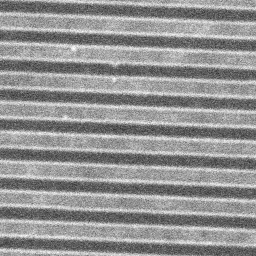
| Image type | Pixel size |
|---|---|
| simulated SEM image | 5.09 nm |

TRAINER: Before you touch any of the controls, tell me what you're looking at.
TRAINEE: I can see parallel lines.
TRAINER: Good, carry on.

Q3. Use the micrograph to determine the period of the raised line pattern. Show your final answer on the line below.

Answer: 150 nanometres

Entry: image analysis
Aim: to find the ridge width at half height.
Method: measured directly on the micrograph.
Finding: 0.0807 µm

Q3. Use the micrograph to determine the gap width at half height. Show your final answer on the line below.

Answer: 71.2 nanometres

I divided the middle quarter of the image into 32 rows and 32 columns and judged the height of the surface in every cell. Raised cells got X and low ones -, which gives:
XXXXXXXXXXXXXXXXXXXXXXXXXXXXXXXX
XXXXXXXXXXXXXXXXXXXXXXXXXXXXXXXX
XXXXXXXXXXXXXXXXXXXXXXXXXXXXXXXX
------------XX-XXXXXXXXXXXXXXXXX
--------------------------------
--------------------------------
XX------------------------------
XXXXXXXXXXXXXXXXXXXXXXXXXXX-----
XXXXXXXXXXXXXXXXXXXXXXXXXXXXXXXX
XXXXXXXXXXXXXXXXXXXXXXXXXXXXXXXX
---------XXXXXXXXXXXXXXXXXXXXXXX
--------------------------------
--------------------------------
X-------------------------------
XXXXXXXXXXXXXXX-----------------
XXXXXXXXXXXXXXXXXXXXXXXXXXXXXXXX
XXXXXXXXXXXXXXXXXXXXXXXXXXXXXXXX
XXXXXXXXXXXXXXXXXXXXXXXXXXXXXXXX
----------------------XXXXXXXXXX
--------------------------------
--------------------------------
XXXXXXXX------------------------
XXXXXXXXXXXXXXXXXXXXXXXXXXXXXXXX
XXXXXXXXXXXXXXXXXXXXXXXXXXXXXXXX
XXXXXXXXXXXXXXXXXXXXXXXXXXXXXXXX
----------X---XXXXXXXXXXXXXXXXXX
--------------------------------
--------------------------------
--------------------------------
XXXXXXXXXXXXXXXXXXXXXX----------
XXXXXXXXXXXXXXXXXXXXXXXXXXXXXXXX
XXXXXXXXXXXXXXXXXXXXXXXXXXXXXXXX